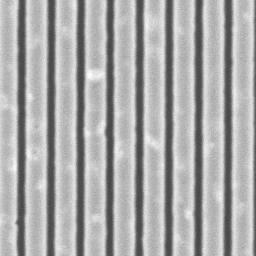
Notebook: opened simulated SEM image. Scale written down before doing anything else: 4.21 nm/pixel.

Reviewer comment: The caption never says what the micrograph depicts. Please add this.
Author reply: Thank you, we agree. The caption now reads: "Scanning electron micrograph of parallel lines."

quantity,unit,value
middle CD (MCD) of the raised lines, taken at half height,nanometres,89.5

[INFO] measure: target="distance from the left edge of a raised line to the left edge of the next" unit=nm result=124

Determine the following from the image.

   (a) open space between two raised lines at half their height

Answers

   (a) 36.3 nm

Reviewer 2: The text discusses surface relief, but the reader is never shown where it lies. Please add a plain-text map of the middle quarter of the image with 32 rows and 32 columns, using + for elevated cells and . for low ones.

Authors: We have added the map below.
+++..+++++...+++++..+++++...++++
+++..+++++...+++++..+++++...++++
+++..+++++...+++++..+++++...++++
+++..+++++...+++++..+++++..+++++
+++..+++++...+++++..+++++..+++++
+++..+++++...+++++..+++++...++++
+++..+++++...+++++..+++++...++++
+++..+++++...+++++..+++++...++++
+++..+++++...+++++..+++++...++++
+++..+++++...+++++..+++++...++++
+++..+++++...+++++..+++++...++++
+++..+++++...+++++..+++++...++++
+++..+++++...+++++..+++++...++++
+++..+++++...+++++..+++++...++++
+++..+++++...+++++..+++++...++++
+++..+++++...+++++..+++++...++++
+++..+++++...+++++..+++++...++++
+++..+++++...+++++..+++++...++++
+++..+++++...+++++..+++++...++++
+++..+++++...+++++..+++++..+++++
+++..+++++...+++++..+++++..+++++
+++..+++++...+++++..+++++..+++++
+++..+++++...+++++..+++++...++++
+++..+++++...+++++..+++++...++++
+++..+++++...+++++..+++++...++++
+++..+++++...+++++..+++++...++++
+++..+++++...+++++..+++++...++++
+++..+++++...+++++..+++++...++++
+++..+++++...+++++..+++++...++++
+++..+++++...+++++..+++++...++++
+++..+++++...+++++..+++++...++++
+++..+++++...+++++..+++++..+++++